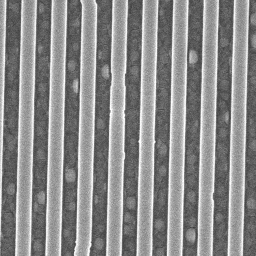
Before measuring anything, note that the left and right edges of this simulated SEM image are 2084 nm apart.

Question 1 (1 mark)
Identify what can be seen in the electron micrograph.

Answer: parallel lines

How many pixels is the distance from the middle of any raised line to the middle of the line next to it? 30.3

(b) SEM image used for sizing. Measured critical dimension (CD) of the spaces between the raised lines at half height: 123 nanometers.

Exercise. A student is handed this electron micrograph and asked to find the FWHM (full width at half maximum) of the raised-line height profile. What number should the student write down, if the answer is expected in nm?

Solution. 123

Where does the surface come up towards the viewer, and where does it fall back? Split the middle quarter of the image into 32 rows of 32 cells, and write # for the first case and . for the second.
....####....###....####....####.
....####....###....####....####.
....####....###....####....###..
....####....###....####....###..
....####....###....####....###..
....####....###....####....###..
....####....###....####....###..
....####....###....####....###..
....####....###....####....###..
....####....###....####....###..
....####....###....####....###..
....####....###....####....###..
....####....###....####....###..
....####....###....####....###..
....####....###....####....###..
....###....####....####....###..
....###....####....####....###..
....###....####....####....###..
....###....####....####....###..
....###....####....####....###..
....###....####....###....####..
....###....####....###....####..
....###....####....###....####..
....###....####....###....####..
....###....####....###....####..
....###....####....###....####..
....###....####....###....####..
....###....####....###....####..
....###....####....###....####..
....###....####....###....####..
....###....####....###....####..
....###....####....###....####..